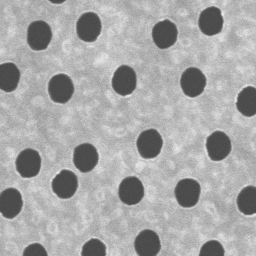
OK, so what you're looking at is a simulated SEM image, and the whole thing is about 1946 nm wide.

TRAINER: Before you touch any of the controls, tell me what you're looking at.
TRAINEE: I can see a regular array of holes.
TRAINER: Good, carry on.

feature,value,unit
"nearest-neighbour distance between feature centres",384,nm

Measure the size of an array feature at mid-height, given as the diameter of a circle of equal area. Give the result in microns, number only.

0.204